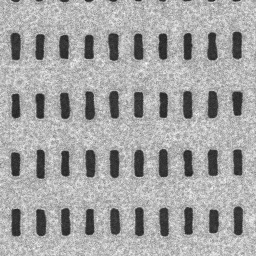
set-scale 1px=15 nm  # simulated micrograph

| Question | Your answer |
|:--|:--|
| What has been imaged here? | a regular array of holes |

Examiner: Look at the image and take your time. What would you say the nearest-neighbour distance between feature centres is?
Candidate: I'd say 365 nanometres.